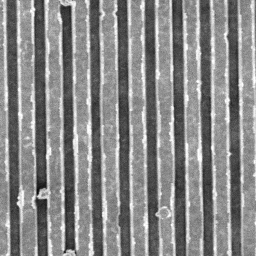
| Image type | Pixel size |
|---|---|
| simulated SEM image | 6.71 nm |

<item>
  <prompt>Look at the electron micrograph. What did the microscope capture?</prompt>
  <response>parallel lines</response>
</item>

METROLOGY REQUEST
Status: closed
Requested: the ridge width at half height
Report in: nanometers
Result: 110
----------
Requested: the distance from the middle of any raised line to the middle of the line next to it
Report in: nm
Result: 186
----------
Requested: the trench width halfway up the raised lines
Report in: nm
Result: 77.2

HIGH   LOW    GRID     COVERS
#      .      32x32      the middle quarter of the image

...###...####...####...####...##
...###...####...####...####...##
...###...####...####...####...##
..####...####...####...####...##
...###...####...####...####...##
...###...####...####...####...##
..#####..####...####...####...##
..#####..####...####...####...##
..#####..####...####...####...##
..#####..####...####...####...##
..#####..####...####...####...##
..#####..####...####....###...##
...####..####....###....###...##
...####..####....###....###...##
...####..####....###....###....#
...####..####....###....###...##
...####...###....###....###...##
...####...####...###....###...##
..#####...####...###...####....#
..#####...####...###...####....#
..#####...####...###...####....#
..#####...####...####..#####...#
...####...####...####...####...#
...####...####...####..#####...#
...####...####...####..#####..##
...####...####...####..#####...#
...####...####...####...###....#
...####...####..#####...###....#
...####...####...####...###....#
...####...####...####...###....#
...####...####...####...###....#
...####...####...####...###....#